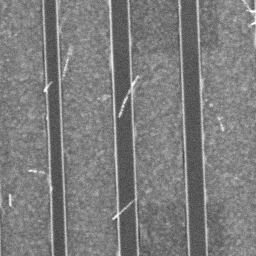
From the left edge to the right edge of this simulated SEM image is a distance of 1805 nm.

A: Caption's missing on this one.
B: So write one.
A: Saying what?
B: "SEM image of one or a few lines or trenches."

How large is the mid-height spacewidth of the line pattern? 366 nanometers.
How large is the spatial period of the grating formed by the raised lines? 487 nm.